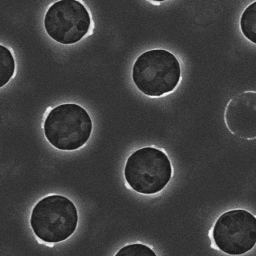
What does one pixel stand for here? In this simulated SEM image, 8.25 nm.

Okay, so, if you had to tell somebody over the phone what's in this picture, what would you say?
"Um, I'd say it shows holes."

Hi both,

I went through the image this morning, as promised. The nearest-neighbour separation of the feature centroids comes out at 760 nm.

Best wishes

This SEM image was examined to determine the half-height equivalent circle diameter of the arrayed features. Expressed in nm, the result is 391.